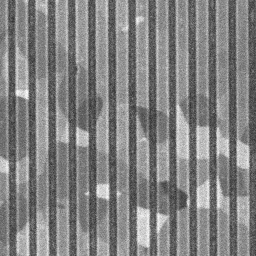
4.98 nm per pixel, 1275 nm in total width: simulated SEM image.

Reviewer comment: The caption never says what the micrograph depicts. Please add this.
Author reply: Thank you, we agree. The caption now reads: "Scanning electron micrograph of parallel lines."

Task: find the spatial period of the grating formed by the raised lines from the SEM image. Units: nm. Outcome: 99.9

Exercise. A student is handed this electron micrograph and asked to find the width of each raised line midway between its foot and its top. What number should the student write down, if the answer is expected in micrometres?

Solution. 0.0548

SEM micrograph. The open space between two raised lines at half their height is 0.0455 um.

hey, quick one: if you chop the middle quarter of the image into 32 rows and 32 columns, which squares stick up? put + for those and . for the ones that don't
+..+++..+++..+++..+++..+++..+++.
+..+++..+++..+++..+++..+++..+++.
+..+++..+++..+++..+++..+++..+++.
+..+++..+++..+++..+++..+++..+++.
+..+++..+++..+++..+++..+++..+++.
+..+++..+++..+++..+++..+++..+++.
+..+++..+++..+++..+++..+++..+++.
+..+++..+++..+++..+++..+++..+++.
+..+++..+++..+++..+++..+++..+++.
+..+++..+++..+++..+++..+++..+++.
+..+++..+++..+++..+++..+++..+++.
+..+++..+++..+++..+++..+++..+++.
+..+++..+++..+++..+++..+++..+++.
+..+++..+++..+++..+++..+++..+++.
+..+++..+++..+++..+++..+++..+++.
+..+++..+++..+++..+++...++..+++.
+..+++..+++..+++..+++...++..+++.
+..+++..+++..+++..+++...++..+++.
+..+++..+++..+++..+++...++..+++.
+..+++..+++..+++..+++...++..+++.
+..+++..+++..+++..+++...++..+++.
+..+++..+++..+++..+++...++..+++.
+..+++..+++..+++..+++...++..+++.
+..+++..+++..+++..+++..+++..+++.
+..+++..+++..+++...++..+++..+++.
+..+++..+++..+++...++..+++..+++.
+..+++..+++..+++...++..+++..+++.
+..+++..+++..+++...++..+++..+++.
+..+++..+++..+++...++..+++..+++.
+..+++..+++..+++...++..+++..+++.
+..+++..+++..+++...++...++..+++.
+..+++..+++..+++...++...++..+++.